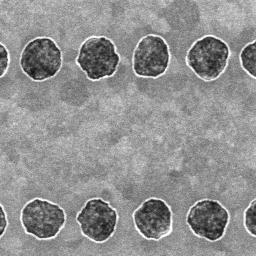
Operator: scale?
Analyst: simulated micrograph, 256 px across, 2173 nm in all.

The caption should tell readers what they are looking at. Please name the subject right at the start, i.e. a regular array of holes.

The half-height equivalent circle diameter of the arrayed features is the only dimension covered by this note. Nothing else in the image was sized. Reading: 334 nm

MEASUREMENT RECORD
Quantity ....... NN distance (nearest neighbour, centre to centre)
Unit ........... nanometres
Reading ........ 467